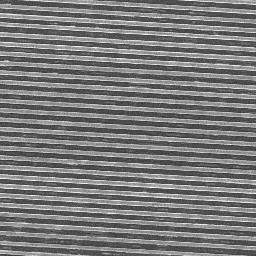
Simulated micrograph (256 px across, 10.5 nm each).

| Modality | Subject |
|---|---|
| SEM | parallel lines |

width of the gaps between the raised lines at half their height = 53.8 nanometres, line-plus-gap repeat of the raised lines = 99.4 nanometers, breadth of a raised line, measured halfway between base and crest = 44.6 nm